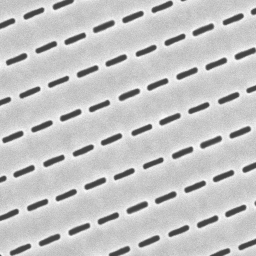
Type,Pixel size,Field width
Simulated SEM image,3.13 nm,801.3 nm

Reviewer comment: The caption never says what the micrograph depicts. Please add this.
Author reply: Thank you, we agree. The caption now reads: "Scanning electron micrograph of a regular array of holes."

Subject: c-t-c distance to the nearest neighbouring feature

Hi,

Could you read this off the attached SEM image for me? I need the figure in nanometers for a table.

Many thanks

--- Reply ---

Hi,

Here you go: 95.5